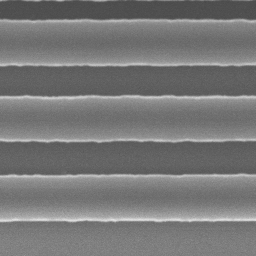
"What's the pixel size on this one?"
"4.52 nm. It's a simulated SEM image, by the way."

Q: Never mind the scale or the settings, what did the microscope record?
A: lines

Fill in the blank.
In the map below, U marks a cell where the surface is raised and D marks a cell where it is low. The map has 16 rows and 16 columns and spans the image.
DDDDDDDDDDDDDDDD
UUUUUUUUUUUUUUUU
UUUUUUUUUUUUUUUU
UUUUUUUUUUUUUUUU
DDDDDDDDDDDDDDDD
DDDDDDDDDDDDDDDD
UUUUUUUUUUUUUUUU
UUUUUUUUUUUUUUUU
UUUUUUUUUUUUUUUU
DDDDDDDDDDDDDDDD
DDDDDDDDDDDDDDDD
UUUUUUUUUUUUUUUU
UUUUUUUUUUUUUUUU
UUUUUUUUUUUUUUUU
DDDDDDDDDDDDDDDD
DDDDDDDDDDDDDDDD